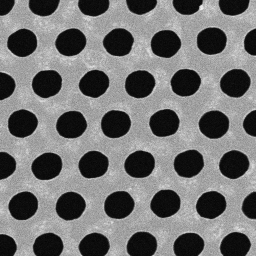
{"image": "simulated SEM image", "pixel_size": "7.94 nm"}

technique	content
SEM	a regular array of holes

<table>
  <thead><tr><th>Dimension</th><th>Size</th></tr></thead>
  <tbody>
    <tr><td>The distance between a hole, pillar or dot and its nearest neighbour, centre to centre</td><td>361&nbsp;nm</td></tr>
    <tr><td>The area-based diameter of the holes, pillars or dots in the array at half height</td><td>0.231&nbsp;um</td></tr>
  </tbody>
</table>